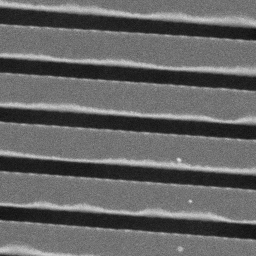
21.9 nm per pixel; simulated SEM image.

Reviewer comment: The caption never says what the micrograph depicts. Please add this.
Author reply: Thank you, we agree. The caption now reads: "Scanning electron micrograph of lines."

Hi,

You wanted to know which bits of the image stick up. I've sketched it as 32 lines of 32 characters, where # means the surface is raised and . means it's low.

################################
.........#######################
.....................###########
#######.........................
######################..........
################################
################################
.....###########################
...................#############
#####...........................
###################.............
################################
################################
...#############################
.................###############
##..............................
#################...............
###############################.
################################
.###############################
..............##################
#...........................####
##############..................
############################....
################################
################################
...........#####################
..........................######
############....................
##########################......
################################
################################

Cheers